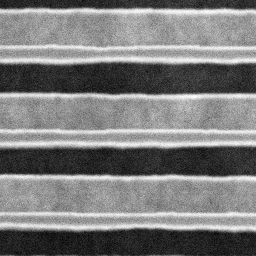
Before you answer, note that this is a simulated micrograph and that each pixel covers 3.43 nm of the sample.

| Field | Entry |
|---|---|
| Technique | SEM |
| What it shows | lines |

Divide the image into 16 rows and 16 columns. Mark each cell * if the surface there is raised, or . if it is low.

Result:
................
****************
****************
****************
................
................
****************
****************
****************
................
................
****************
****************
****************
................
................